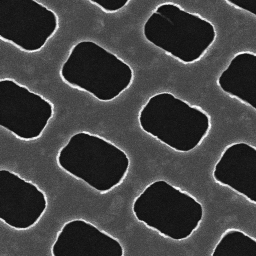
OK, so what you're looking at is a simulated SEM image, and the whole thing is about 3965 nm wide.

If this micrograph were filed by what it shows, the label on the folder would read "holes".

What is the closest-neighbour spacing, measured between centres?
1380 nm